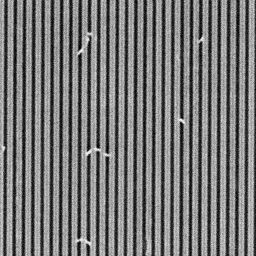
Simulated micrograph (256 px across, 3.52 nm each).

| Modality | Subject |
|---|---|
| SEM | parallel lines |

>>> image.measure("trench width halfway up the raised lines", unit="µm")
0.0136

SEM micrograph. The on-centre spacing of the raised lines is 0.0327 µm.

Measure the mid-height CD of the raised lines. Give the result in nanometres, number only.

16.7